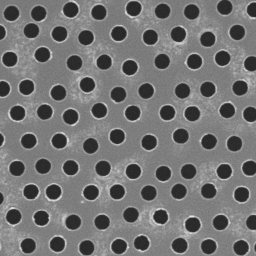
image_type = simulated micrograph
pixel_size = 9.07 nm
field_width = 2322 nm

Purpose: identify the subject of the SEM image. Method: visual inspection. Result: a regular array of holes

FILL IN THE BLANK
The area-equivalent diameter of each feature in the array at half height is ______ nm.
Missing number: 141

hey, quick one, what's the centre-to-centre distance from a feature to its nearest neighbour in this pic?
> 237 nm